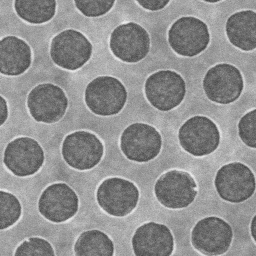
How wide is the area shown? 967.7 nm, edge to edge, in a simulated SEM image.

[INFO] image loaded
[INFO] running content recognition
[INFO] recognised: a regular array of holes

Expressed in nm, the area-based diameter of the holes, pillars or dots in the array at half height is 155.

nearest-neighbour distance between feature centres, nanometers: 219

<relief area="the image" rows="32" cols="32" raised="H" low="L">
HHLLLLLHHLLLLLHHHLLLLHHHHHHHHHHH
HHLLLLLHHHLLLHHHHHHHHHHHHHHHHHLL
HHHLLLHHHHHHHHHHHHHHHHLLLHHHLLLL
HHHHHHHHHHHHHHHLLLHHHLLLLLHHLLLL
HLHHHHHLLLLHHHLLLLLHHLLLLLHHLLLL
LLLLHHLLLLLHHHLLLLLHHLLLLLHHHLLL
LLLLHHLLLLLHHHLLLLLHHHLLLHHHHHHH
LLLLHHHLLLLHHHHLLLHHHHHHHHHHHHHH
LLLHHHHHLLHHHHHHHHHHHHHHHHLLLLHH
HLHHHHHHHHHHHLHHHHHLLLLHHHLLLLHH
HHHHHLHHHHHLLLLHHHLLLLLHHLLLLLHH
HHHHLLLLHHHLLLLLHHLLLLLHHHLLLLHH
LHHLLLLLHHHLLLLLHHLLLLLHHHLLLHHH
LHHHLLLLHHHLLLLHHHHLLLHHHHHHHHHH
LHHHLLLLHHHHHHHHHHHHHHHHLHHHHHLL
HHHHHHHHHHHHHHHHHLHHHHHLLLLHHHLL
HHHHHHHHHLLHHHHLLLLLHHLLLLLHHHLL
HHLLHHHHLLLLLHHLLLLLHHLLLLLHHHLL
HLLLLHHHLLLLLHHLLLLLHHHLLLLHHHHH
HLLLLLHHLLLLLHHHLLLLHHHHLHHHHHHH
HLLLLHHHHLLLHHHHHHHHHHHHHHHHLLHH
HLLLLHHHHHHHHHHHHHHHHLLHHHHLLLLL
HHHHHHHHHHHHHLLLHHHHLLLLHHHLLLLL
HHHHHHLLLHHHLLLLLHHLLLLLLHHLLLLL
LLHHHLLLLLHHLLLLLHHLLLLLHHHHLLLH
LLLHHLLLLLHHLLLLLHHHLLLLHHHHHHHH
LLLHHLLLLLHHHLLLHHHHHHHHHHHHHHHH
LLHHHHLLHHHHHHHHHHHHHHHHHLLLHHHL
LHHHHHHHHHHHHHHHHLLLLHHHLLLLLHHL
HHHHHHHHHHLLLHHHHLLLLLHHLLLLLHHL
HHLLLLHHHLLLLLHHHLLLLLHHLLLLLHHH
HHLLLLLHHLLLLLHHHLLLLLHHHLLLHHHH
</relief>